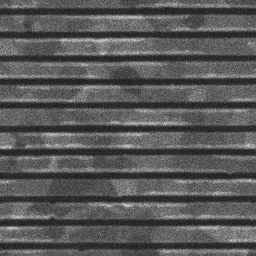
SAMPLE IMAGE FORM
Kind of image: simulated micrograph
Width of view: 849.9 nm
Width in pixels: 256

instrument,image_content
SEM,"parallel lines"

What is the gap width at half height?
7.5 px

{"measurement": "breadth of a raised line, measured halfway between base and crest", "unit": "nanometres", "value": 53.5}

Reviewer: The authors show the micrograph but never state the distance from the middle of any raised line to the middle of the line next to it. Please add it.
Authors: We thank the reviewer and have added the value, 0.0777 microns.